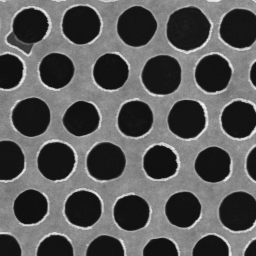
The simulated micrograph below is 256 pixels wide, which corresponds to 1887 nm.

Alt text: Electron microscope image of a regular array of holes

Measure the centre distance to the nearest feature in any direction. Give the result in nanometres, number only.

373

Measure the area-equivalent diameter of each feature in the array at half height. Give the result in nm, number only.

265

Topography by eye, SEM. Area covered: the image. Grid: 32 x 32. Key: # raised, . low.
################################
###..###....####...###...####..#
##....##....###....##.....##....
##....##....###.....#.....#.....
##....##....###....##.....##....
################..####...####..#
################################
..###....###...####...###...####
...##....###....##.....##....##.
...##....###....##.....#.....##.
..####..####...###....###...####
###################...####.#####
###..###########################
##....###...###....###...###....
##....##....###....##.....##....
##....##....###....##.....##....
##....###..####...####...###...#
################################
..###....###...####..#####.#####
...##....##....###....###....##.
...##....##.....##....##.....##.
...##....##....###....###....##.
.#####.###################..####
################################
##...####...####.#####..#####..#
##....##.....#....###....###....
##....##.....#.....##....##.....
##...####...##....###....###....
###############...##########...#
.######.#####.############.#####
..###....##....###....###...###.
...##....##....###....##.....##.